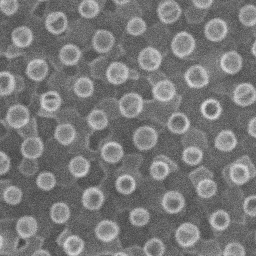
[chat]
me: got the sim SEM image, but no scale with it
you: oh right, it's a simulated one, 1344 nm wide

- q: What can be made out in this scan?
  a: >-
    a regular array of raised bodies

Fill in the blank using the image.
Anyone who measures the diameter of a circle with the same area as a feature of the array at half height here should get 96.2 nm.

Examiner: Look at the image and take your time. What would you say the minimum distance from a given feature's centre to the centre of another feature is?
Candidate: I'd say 110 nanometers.